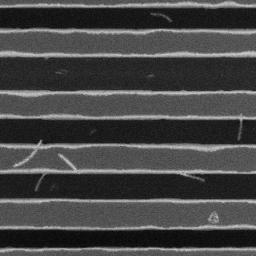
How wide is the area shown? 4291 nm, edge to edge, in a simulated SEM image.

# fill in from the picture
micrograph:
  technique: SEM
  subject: lines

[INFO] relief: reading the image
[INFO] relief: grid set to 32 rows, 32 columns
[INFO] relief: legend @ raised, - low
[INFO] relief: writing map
@@@@@@@@@@@@@@@@@@@@@@@@@@@@@@@@
--------------------------------
--------------------------------
--------------------------------
@@@@@@@@@@@@@@@@@@@@@@@@@@@@@@@@
@@@@@@@@@@@@@@@@@@@@@@@@@@@@@@@@
@@@@@@@@@@@@@@@@@@@@@@@@@@@@@@@@
--------------------------------
--------------------------------
--------------------------------
--------------------------------
@@@-@@@@@@@@@@@@@@@@@@@@@@@@@@@@
@@@@@@@@@@@@@@@@@@@@@@@@@@@@@@@@
@@@@@@@@@@@@@@@@@@@@@@@@@@@@@@@@
@@@@@@@@@@@@@@@@@@@@@@@@@@@@@@@@
--------------------------------
--------------------------------
--------------------------------
@@@@@@@@@@@@@@@@@@@@@@@@@@@@@@@@
@@@@@@@@@@@@@@@@@@@@@@@@@@@@@@@@
@@@@@@@@@@@@@@@@@@@@@@@@@@@@@@@@
@@@@@@@@@@@@@@@@@@@@@@@@@@@@@@@@
--------------------------------
--------------------------------
--------------------------------
@@@@@@@@@@@@@@@@@@@@@@@@@@@@@@@@
@@@@@@@@@@@@@@@@@@@@@@@@@@@@@@@@
@@@@@@@@@@@@@@@@@@@@@@@@@@@@@@@@
@@@@@@@@@@@@@@@@@@@@@@@@@@@@@@@@
--------------------------------
--------------------------------
@@@@@@@@@@@@@@@@@@@@@@@@@@@@@@@@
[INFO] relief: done